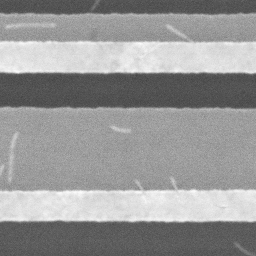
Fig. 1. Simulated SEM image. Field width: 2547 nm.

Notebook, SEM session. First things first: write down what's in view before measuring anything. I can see lines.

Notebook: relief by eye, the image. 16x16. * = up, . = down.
................
****************
****************
****************
**...**.*..*****
................
................
****************
****************
****************
****************
****************
****************
****************
................
................